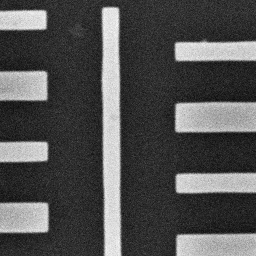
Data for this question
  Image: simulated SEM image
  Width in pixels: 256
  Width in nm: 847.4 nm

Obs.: groups of lines, slits or small figures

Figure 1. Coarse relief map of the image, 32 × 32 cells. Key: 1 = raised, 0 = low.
00000000000000000000000000000000
11111100000001100000000000000000
11111100000001100000000000000000
11111100000001100000000000000000
00000000000001100000000000000000
00000000000001100000001111111111
00000000000001100000001111111111
00000000000001100000001111100000
00000000000001100000000000000000
11111100000001100000000000000000
11111100000001100000000000000000
11111100000001100000000000000000
00000000000001100000000000000000
00000000000001100000001111111111
00000000000001100000001111111111
00000000000001100000001111111111
00000000000001100000000000000000
00000000000001100000000000000000
11111100000001100000000000000000
11111100000001100000000000000000
00000000000001100000000000000000
00000000000001100000000000000000
00000000000001100000001111111111
00000000000001100000001111111111
00000000000001100000000000000000
11111100000001100000000000000000
11111100000001100000000000000000
11111100000001100000000000000000
11111100000001100000000000000000
00000000000001100000001111111111
00000000000001100000001111111111
00000000000001100000001111111111